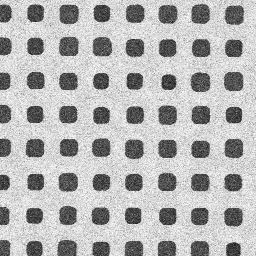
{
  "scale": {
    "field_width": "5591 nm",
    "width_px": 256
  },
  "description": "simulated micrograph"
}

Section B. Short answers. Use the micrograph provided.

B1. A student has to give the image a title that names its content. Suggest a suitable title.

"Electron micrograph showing a regular array of holes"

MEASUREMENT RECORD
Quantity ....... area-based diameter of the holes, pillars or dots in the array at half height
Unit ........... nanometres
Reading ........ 424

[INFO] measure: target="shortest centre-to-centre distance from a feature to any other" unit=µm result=0.713